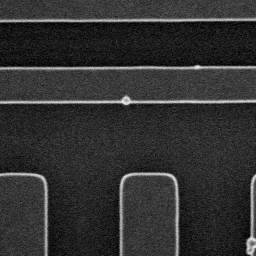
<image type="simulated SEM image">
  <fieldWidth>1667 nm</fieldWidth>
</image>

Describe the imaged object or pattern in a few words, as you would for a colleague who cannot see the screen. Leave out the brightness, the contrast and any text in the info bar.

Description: groups of lines, slits or small figures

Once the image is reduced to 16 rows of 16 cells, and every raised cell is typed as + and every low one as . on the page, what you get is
++++++++++++++++
................
................
................
++++++++++++++++
++++++++++++++++
................
................
................
................
................
+++.....+++.....
+++.....+++.....
+++.....+++.....
+++.....+++.....
+++.....+++....+